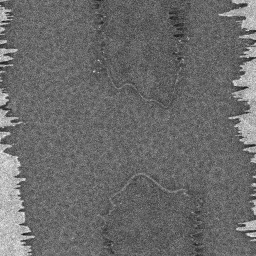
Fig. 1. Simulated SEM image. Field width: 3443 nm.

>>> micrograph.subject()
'one or a few lines or trenches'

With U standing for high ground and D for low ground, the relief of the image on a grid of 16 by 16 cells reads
DDDDDDUUUUUDDDDU
DDDDDDUUUUUDDDDU
DDDDDDUUUUUDDDDD
DDDDDDUUUUUDDDDD
DDDDDDDUUUUDDDDU
DDDDDDDDUUUDDDDU
DDDDDDDDDDDDDDDU
UDDDDDDDDDDDDDDU
DDDDDDDDDDDDDDDU
UDDDDDDDDDDDDDDD
UDDDDDDDDDDDDDDD
UDDDDDDDUUDDDDDD
UDDDDDDUUUUUDDDD
UDDDDDDUUUUUDDDD
UUDDDDDUUUUUDDDD
UUDDDDDUUUUUDDDD